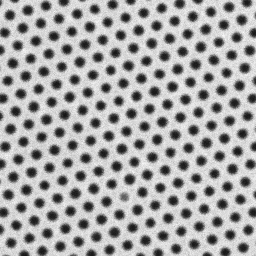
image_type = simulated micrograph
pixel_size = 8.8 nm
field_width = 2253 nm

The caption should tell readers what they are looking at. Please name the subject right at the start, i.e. a regular array of holes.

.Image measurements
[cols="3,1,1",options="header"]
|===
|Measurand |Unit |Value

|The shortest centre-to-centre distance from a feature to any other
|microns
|0.16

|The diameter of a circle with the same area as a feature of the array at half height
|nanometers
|105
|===